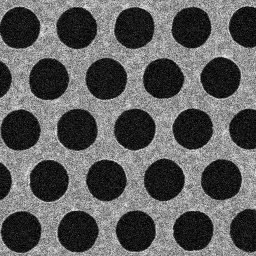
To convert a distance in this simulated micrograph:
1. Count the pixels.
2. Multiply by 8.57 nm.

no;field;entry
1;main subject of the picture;a regular array of holes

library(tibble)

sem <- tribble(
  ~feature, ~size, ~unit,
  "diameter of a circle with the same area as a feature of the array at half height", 40.9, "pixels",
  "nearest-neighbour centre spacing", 492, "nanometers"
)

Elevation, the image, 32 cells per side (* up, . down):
********************************
*...****...****...****....***...
.....**.....**.....***....***...
.....**.....**.....**.....***...
.....**.....**.....***....***...
*...****...****...****...*****..
********************************
*****..*****..*****..*****...***
.***....***.....**....***.....**
.***.....**.....**.....**.....**
.***.....**.....**.....**.....**
.***....***....***....****...***
********************************
********************************
*...****....***....***....***...
.....**.....**.....***.....**...
.....**.....**.....***.....**...
.....**.....***....***....***...
*...****...*****..*****..*****..
********************************
*****...****...****...****...***
.***....***.....**.....**.....**
..**.....**.....**.....**.....**
.***....***.....**.....**.....**
.***....****...****...****...***
********************************
**.******..*****..*****..*****..
*....***....***....***....***...
.....**.....***....***.....**...
.....**.....***....***.....**...
*....***....***....***....***...
**.******.*********************.